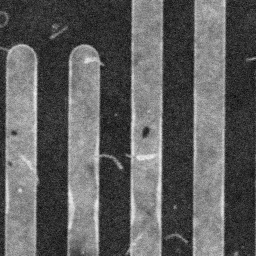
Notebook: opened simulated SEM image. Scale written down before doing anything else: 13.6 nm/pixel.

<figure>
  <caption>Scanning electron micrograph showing groups of lines, slits or small figures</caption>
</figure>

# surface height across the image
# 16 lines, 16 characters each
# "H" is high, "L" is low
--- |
LLLLLLLLHHLLHHLL
LLLLLLLLHHLLHHLL
LLLLLLLLHHLLHHLL
HHLLHHLLHHLLHHLL
HHLLHHLLHHLLHHLL
HHLLHHLLHHLLHHLL
HHLLHHLLHHLLHHLL
HHLLHHLLHHLLHHLL
HHLLHHLLHHLLHHLL
HHLLHHLLHHLLHHLL
HHLLHHLLHHLLHHLL
HHLLHHLLHHLLHHLL
HHLLHHLLHHLLHHLL
HHLLHHLLHHLLHHLL
HHLLHHLLHHLLHHLL
HHLLHHLLHHLLHHLL